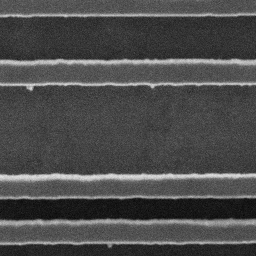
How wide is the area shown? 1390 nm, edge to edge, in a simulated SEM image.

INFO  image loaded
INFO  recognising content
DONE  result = lines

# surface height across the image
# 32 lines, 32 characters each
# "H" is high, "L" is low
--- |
HHHHHHHHHHHHHHHHHHHHHHHHHHHHHHHH
HHHHHHHHHHHHHHHHHHHHHHHHHHHHHHHH
LLLLLLLLLLLLLLLLLLLLLLLLLLLLLLLL
LLLLLLLLLLLLLLLLLLLLLLLLLLLLLLLL
LLLLLLLLLLLLLLLLLLLLLLLLLLLLLLLL
LLLLLLLLLLLLLLLLLLLLLLLLLLLLLLLL
LLLLLLLLLLLLLLLLLLLLLLLLLLLLLLLL
LLLLLLLHLLLLLLLLLLLLLHHHHHLLLHLL
HHHHHHHHHHHHHHHHHHHHHHHHHHHHHHHH
HHHHHHHHHHHHHHHHHHHHHHHHHHHHHHHH
HHHHHHHHHHHHHHHHHHHHHHHHHHHHHHHH
LLLLLLLLLLLLLLLLLLLLLLLLLLLLLLLL
LLLLLLLLLLLLLLLLLLLLLLLLLLLLLLLL
LLLLLLLLLLLLLLLLLLLLLLLLLLLLLLLL
LLLLLLLLLLLLLLLLLLLLLLLLLLLLLLLL
LLLLLLLLLLLLLLLLLLLLLLLLLLLLLLLL
LLLLLLLLLLLLLLLLLLLLLLLLLLLLLLLL
LLLLLLLLLLLLLLLLLLLLLLLLLLLLLLLL
LLLLLLLLLLLLLLLLLLLLLLLLLLLLLLLL
LLLLLLLLLLLLLLLLLLLLLLLLLLLLLLLL
LLLLLLLLLLLLLLLLLLLLLLLLLLLLLLLL
LLLLLLLLLLLLLLLLLLLLLLLLLLLLLLLL
HHHHHHHHHHHHHHHHHHHHHHHHHHHHHHHH
HHHHHHHHHHHHHHHHHHHHHHHHHHHHHHHH
HHHHHHHHHHHHHHHHHHHHHHHHHHHHHHHH
LLLLLLLLLLLLLLLLLLLLLLLLLLLLLLLL
LLLLLLLLLLLLLLLLLLLLLLLLLLLLLLLL
LLLLHLLHLLLLHHHHLLLLLHHLLLLLHHLH
HHHHHHHHHHHHHHHHHHHHHHHHHHHHHHHH
HHHHHHHHHHHHHHHHHHHHHHHHHHHHHHHH
HHHHLLHLLHHLLLLLLLHLLLHLLLLLLLLL
LLLLLLLLLLLLLLLLLLLLLLLLLLLLLLLL